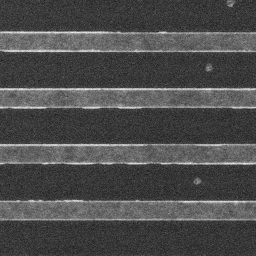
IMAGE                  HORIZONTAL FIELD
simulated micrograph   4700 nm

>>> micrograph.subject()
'lines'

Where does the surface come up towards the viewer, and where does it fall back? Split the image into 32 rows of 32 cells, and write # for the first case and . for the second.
................................
................................
................................
................................
################################
################################
................................
................................
................................
................................
................................
################################
################################
................................
................................
................................
................................
................................
################################
################################
................................
................................
................................
................................
................................
################################
################################
................................
................................
................................
................................
................................